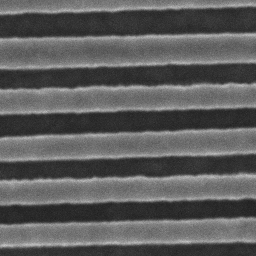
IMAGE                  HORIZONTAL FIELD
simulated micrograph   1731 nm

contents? lines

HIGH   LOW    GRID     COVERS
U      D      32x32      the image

UUUUUUUUUUUUUUUUUUUUUUUUUUUUUUUU
UUUDDUUDDDDDDDDDDDDDDDDDDDDDDDDD
DDDDDDDDDDDDDDDDDDDDDDDDDDDDDDDD
DDDDDDDDDDDDDDDDDDDDDDDDDDDDDDDD
DDDDDDDDDDDDDDDDDDDDDDDUUUUUUUUU
UUUUUUUUUUUUUUUUUUUUUUUUUUUUUUUU
UUUUUUUUUUUUUUUUUUUUUUUUUUUUUUUU
UUUUUUUUUUUUUUUUUUUUUUUUUUUUUUUU
UUUUUDDDDDDDDDDDDDDDDDDDDDDDDDDD
DDDDDDDDDDDDDDDDDDDDDDDDDDDDDDDD
DDDDDDDDDDDDDDDDDDDDDDDDDDDDDDDD
UUUUUUUUUUUUUUUUUUUUUUUUUUUUUUUU
UUUUUUUUUUUUUUUUUUUUUUUUUUUUUUUU
UUUUUUUUUUUUUUUUUUUUUUUUUUUDDDDD
DDDDDDDDDDDDDDDDDDDDDDDDDDDDDDDD
DDDDDDDDDDDDDDDDDDDDDDDDDDDDDDDD
DDDDDDDDDDDDDDDDDDDDDDDUUUUUUUUU
UUUUUUUUUUUUUUUUUUUUUUUUUUUUUUUU
UUUUUUUUUUUUUUUUUUUUUUUUUUUUUUUU
UUUUUUUUUUUUUUUUUUUUUDDDDDDDDDDD
DDDDDDDDDDDDDDDDDDDDDDDDDDDDDDDD
DDDDDDDDDDDDDDDDDDDDDDDDDDDDDDDD
DDDDDDDDUDDUUUUUUUUUUUUUUUUUUUUU
UUUUUUUUUUUUUUUUUUUUUUUUUUUUUUUU
UUUUUUUUUUUUUUUUUUUUUUUUUUUUUUUU
UUUUUDDDDDDDDDDDDDDDDDDDDDDDDDDD
DDDDDDDDDDDDDDDDDDDDDDDDDDDDDDDD
DDDDDDDDDDDDDDDDDDDDDDDDDDDUDUUU
UUUUUUUUUUUUUUUUUUUUUUUUUUUUUUUU
UUUUUUUUUUUUUUUUUUUUUUUUUUUUUUUU
UUUUUUUUUUUUUDDUDDDDDDDDDDDDDDDD
DDDDDDDDDDDDDDDDDDDDDDDDDDDDDDDD